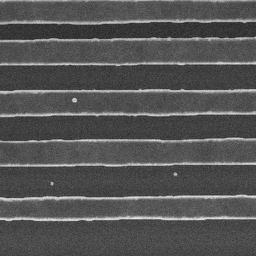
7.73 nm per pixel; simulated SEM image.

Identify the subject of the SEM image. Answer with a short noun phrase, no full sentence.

lines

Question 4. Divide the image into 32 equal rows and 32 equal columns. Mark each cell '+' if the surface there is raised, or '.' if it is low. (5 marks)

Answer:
++++++++++++++++++++++++++++++++
++++++++++++++++++++++++++++++++
++++++++++++++++++++++++++++++++
................................
................................
++++++++++++++++++++++++++++++++
++++++++++++++++++++++++++++++++
++++++++++++++++++++++++++++++++
................................
................................
................................
++++++++++++++++++++++++++++++++
++++++++++++++++++++++++++++++++
++++++++++++++++++++++++++++++++
+...............................
................................
................................
.........................+++++++
++++++++++++++++++++++++++++++++
++++++++++++++++++++++++++++++++
++++++++++++++++++++++++++++++++
................................
................................
................................
..............................+.
++++++++++++++++++++++++++++++++
++++++++++++++++++++++++++++++++
.+..++++++......................
................................
................................
................................
................................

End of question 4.